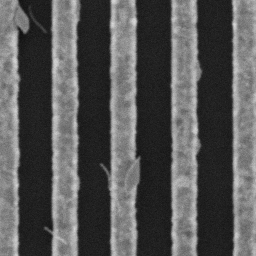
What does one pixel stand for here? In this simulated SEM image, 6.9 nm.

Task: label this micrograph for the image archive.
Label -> lines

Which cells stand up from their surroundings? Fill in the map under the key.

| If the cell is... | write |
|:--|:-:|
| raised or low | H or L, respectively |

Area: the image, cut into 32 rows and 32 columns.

HHLLLLLHHLLLLLHHHLLLLLHHLLLLLHHH
HHHLLLLHHLLLLLHHHLLLLLHHLLLLLHHH
HHHHLLLHHHLLLLHHHLLLLLHHLLLLLHHH
HHHHLLLHHLLLLLHHHLLLLLHHLLLLLHHH
HHLLLLLHHHLLLLHHHLLLLLHHLLLLLHHH
HHLLLLLHHLLLLLHHHLLLLLHHLLLLLHHH
HHLLLLLHHLLLLLHHHLLLLLHHHLLLLHHH
HHLLLLLHHHLLLLHHHLLLLLHHLLLLLHHH
HHLLLLLHHHLLLLHHHLLLLLHHLLLLLHHH
HHLLLLLHHHLLLLHHHLLLLLHHLLLLLHHH
HHLLLLLHHHLLLLHHHLLLLLHHLLLLLHHH
HHLLLLLHHHLLLLHHHLLLLLHHLLLLLHHH
HHLLLLLHHHLLLLHHHLLLLLHHLLLLLHHH
HHLLLLLHHHLLLLHHHLLLLLHHLLLLLHHH
HHLLLLLHHHLLLLHHHLLLLLHHLLLLLHHH
HHLLLLLHHHLLLLHHHLLLLLHHHLLLLHHH
HHLLLLLHHHLLLLHHHLLLLLHHHLLLLHHH
HHLLLLLHHHLLLLHHHLLLLLHHHLLLLHHH
HHLLLLLHHHLLLLHHHLLLLLHHLLLLLHHH
HHLLLLLHHHLLLLHHHLLLLLHHLLLLLHHH
HHLLLLLHHHLLLLHHHLLLLLHHLLLLLHHH
HHLLLLLHHHLLLLHHHLLLLLHHHLLLLHHH
HHLLLLLHHHLLLLHHHLLLLLHHLLLLLHHH
HHLLLLLHHHLLLLHHHLLLLLHHLLLLLHHH
HHLLLLLHHHLLLLHHHLLLLLHHLLLLLHHH
HHLLLLLHHHLLLLHHHLLLLLHHLLLLLHHH
HHLLLLLHHLLLLLHHHLLLLLHHLLLLLHHH
HHLLLLLHHHLLLLHHHLLLLLHHLLLLLHHH
HHLLLLLHHHLLLLHHHLLLLLHHLLLLLHHH
HHLLLLLHHHLLLLHHHLLLLLHHLLLLLHHH
HHLLLLLHHLLLLLHHHLLLLLHHLLLLLHHH
HHLLLLLHHHLLLLHHHLLLLLHHLLLLLHHH